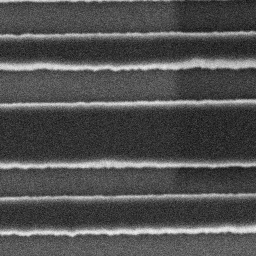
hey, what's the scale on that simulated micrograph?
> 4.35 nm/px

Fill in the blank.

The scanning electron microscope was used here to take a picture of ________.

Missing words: lines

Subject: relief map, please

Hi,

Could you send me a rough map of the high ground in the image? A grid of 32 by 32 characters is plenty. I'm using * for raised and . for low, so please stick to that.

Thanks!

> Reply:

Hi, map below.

................................
................................
................................
................................
********************************
********************************
********************************
********************************
.***..*************.............
................................
................................
................................
................................
********************************
********************************
********************************
********************************
********************************
********************************
********************************
********************************
................................
................................
................................
..................**************
********************************
********************************
********************************
********************************
................................
................................
................................